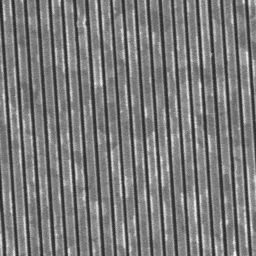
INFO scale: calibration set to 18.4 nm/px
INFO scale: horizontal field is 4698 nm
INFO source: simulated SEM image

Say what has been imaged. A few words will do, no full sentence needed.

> parallel lines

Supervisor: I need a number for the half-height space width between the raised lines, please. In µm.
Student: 0.071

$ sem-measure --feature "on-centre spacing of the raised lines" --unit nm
225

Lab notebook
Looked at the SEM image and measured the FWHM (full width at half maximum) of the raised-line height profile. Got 142 nm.